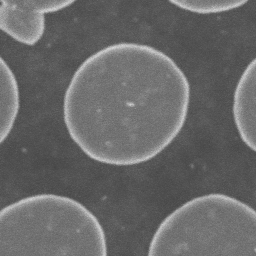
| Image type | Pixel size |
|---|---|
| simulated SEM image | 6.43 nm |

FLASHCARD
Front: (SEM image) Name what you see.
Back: raised bodies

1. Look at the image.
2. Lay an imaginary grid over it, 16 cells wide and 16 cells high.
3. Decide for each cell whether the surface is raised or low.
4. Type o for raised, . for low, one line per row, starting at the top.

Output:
oooo.......oooo.
ooo.............
.o..............
......oooo......
o....oooooo....o
o...oooooooo...o
o...oooooooo...o
o...ooooooo....o
.....oooooo....o
.....ooooo......
................
................
..oo........ooo.
oooooo.....ooooo
oooooo....oooooo
ooooooo..ooooooo